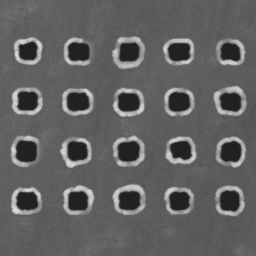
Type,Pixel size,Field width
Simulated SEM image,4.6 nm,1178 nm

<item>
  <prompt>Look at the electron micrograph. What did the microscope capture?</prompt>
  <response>a regular array of holes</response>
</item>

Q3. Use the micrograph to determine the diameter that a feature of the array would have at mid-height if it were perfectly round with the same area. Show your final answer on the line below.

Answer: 96.3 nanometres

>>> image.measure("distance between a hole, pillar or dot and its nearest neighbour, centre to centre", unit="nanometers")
228